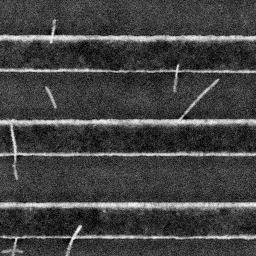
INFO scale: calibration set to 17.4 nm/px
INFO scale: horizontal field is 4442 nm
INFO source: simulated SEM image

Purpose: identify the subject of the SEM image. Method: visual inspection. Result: lines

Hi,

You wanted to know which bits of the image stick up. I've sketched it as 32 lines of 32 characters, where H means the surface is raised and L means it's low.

LLLLLLLLLLLLLLLLLLLLLLLLLLLLLLLL
LLLLLLLLLLLLLLLLLLLLLLLLLLLLLLLL
LLLLLLLLLLLLLLLLLLLLLLLLLLLLLLLL
LLLLLLLLLLLLLLLLLLLLLLLLLLLLLLLL
LHLHLLHLLLLLLLLLLLLLLLLLLLLLLLLL
HHHHHHHHHHHHHHHHHHHHHHHHHHHHHHHH
HHHHHHHHHHHHHHHHHHHHHHHHHHHHHHHH
HHHHHHHHHHHHHHHHHHHHHHHHHHHHHHHH
HHHHHHHHHHHHHHHHHHHHHHHHHHHHHHHH
LLLLLLLLLLLLLLLLLLLLLLLLLLLLLLLL
LLLLLLLLLLLLLLLLLLLLLLLLLLLLLLLL
LLLLLLLLLLLLLLLLLLLLLLLLLLLLLLLL
LLLLLLLLLLLLLLLLLLLLLLLLLLLLLLLL
LLLLLLLLLLLLLLLLLLLLLLLLLLLLLLLL
LLLLLLLLLLLLLLLLLLLLLLLLLLLLLLLL
HHHHHHHHHHHHHHHHHHHHHHHHHHHHHHHH
HHHHHHHHHHHHHHHHHHHHHHHHHHHHHHHH
HHHHHHHHHHHHHHHHHHHHHHHHHHHHHHHH
HHHHHHHHHHHHHHHHHHHHHHHHHHHHHHHH
LHLLLLLLLLLLLLLLLLLLLLLLLLLLLLLL
LLLLLLLLLLLLLLLLLLLLLLLLLLLLLLLL
LLLLLLLLLLLLLLLLLLLLLLLLLLLLLLLL
LLLLLLLLLLLLLLLLLLLLLLLLLLLLLLLL
LLLLLLLLLLLLLLLLLLLLLLLLLLLLLLLL
LLLLLLLLLLLLLLLLLLLLLLLLLLLLLLLL
LLLLLHHHLHHHHHHLHHLHLHLHHHHHHHHH
HHHHHHHHHHHHHHHHHHHHHHHHHHHHHHHH
HHHHHHHHHHHHHHHHHHHHHHHHHHHHHHHH
HHHHHHHHHHHHHHHHHHHHHHHHHHHHHHHH
HHHHHHHHHHHHHHHHHHHHHHHHHHHHHHHH
LLLLLLLLLLLLLLLLLLLLLLLLLLLLLLLL
LLLLLLLLLLLLLLLLLLLLLLLLLLLLLLLL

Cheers